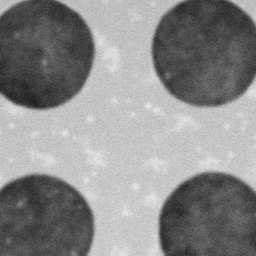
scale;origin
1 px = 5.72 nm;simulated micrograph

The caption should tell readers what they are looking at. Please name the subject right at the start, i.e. holes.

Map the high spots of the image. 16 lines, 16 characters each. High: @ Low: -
@---@@@@@@@----@
-----@@@@@------
------@@@@------
------@@@@------
------@@@@------
-----@@@@@------
@---@@@@@@@@--@@
@@@@@@@@@@@@@@@@
@@@@@@@@@@@@@@@@
@@@@@@@@@@@@@@@@
@@@@@@@@@@@@@@@@
----@@@@@@@----@
-----@@@@@------
------@@@@------
------@@@@------
------@@@@------